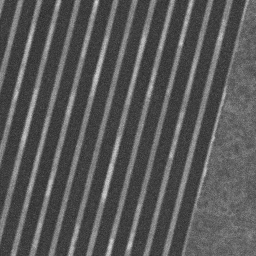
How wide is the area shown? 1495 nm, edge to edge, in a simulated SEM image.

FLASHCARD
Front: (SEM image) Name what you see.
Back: parallel lines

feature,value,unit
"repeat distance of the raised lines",108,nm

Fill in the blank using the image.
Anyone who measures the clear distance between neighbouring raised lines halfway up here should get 86.4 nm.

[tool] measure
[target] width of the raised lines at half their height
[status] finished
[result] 20.5 nm